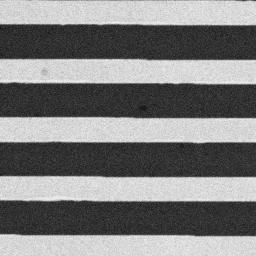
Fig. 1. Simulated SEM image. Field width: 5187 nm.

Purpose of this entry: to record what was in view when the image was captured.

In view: lines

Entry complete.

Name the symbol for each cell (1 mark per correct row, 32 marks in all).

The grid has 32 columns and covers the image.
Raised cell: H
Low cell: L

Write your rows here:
HHHHHHHHHHHHHHHHHHHHHHHHHHHHHHHH
HHHHHHHHHHHHHHHHHHHHHHHHHHHHHHHH
HHHHHHHHHHHHHHHHHHHHHHHHHHHHHHHH
LLLLLLLLLLLLLLLLLLLLLLLLLLLLLLLL
LLLLLLLLLLLLLLLLLLLLLLLLLLLLLLLL
LLLLLLLLLLLLLLLLLLLLLLLLLLLLLLLL
LLLLLLLLLLLLLLLLLLLLLLLLLLLLLLLL
HHHHHHHHHHHHHHHHHHLLLLLLLLLLLLLL
HHHHHHHHHHHHHHHHHHHHHHHHHHHHHHHH
HHHHHHHHHHHHHHHHHHHHHHHHHHHHHHHH
LLLLLLLLLLLLLLLLLLLLLLLLLLLLLLLL
LLLLLLLLLLLLLLLLLLLLLLLLLLLLLLLL
LLLLLLLLLLLLLLLLLLLLLLLLLLLLLLLL
LLLLLLLLLLLLLLLLLLLLLLLLLLLLLLLL
LLLLLLLLLLLLLLLLLLLLLLLLLLLLLLLL
HHHHHHHHHHHHHHHHHHHHHHHHHHHHHHHH
HHHHHHHHHHHHHHHHHHHHHHHHHHHHHHHH
HHHHHHHHHHHHHHHHHHHHHHHHHHHHHHHH
LLLLLLLLLLLLLLLLLLLLLLLLLLLLLLLL
LLLLLLLLLLLLLLLLLLLLLLLLLLLLLLLL
LLLLLLLLLLLLLLLLLLLLLLLLLLLLLLLL
LLLLLLLLLLLLLLLLLLLLLLLLLLLLLLLL
HHHHHHHHHHHHHHHHHHHHHHHHHHHHHHHH
HHHHHHHHHHHHHHHHHHHHHHHHHHHHHHHH
HHHHHHHHHHHHHHHHHHHHHHHHHHHHHHHH
LLLLLLLLLLLLLLLLLLLLLLLLLLLLLLLL
LLLLLLLLLLLLLLLLLLLLLLLLLLLLLLLL
LLLLLLLLLLLLLLLLLLLLLLLLLLLLLLLL
LLLLLLLLLLLLLLLLLLLLLLLLLLLLLLLL
HHHLLLLLLLLLLLLLLLLLLLLLLLLLLLLL
HHHHHHHHHHHHHHHHHHHHHHHHHHHHHHHH
HHHHHHHHHHHHHHHHHHHHHHHHHHHHHHHH